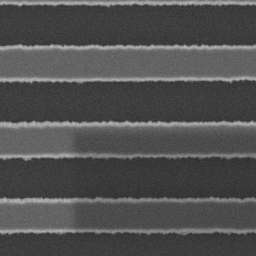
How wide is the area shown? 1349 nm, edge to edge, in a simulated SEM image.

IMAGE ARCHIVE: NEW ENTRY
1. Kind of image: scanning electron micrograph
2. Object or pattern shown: lines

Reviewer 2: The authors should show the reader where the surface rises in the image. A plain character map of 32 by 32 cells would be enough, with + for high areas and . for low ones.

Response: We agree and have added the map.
..+++++.++.+++......+.++......++
................................
................................
................................
................................
................................
++++++++++++++++++++++++++++++++
++++++++++++++++++++++++++++++++
++++++++++++++++++++++++++++++++
++++++++++++++++++++++++++++++++
................................
................................
................................
................................
................................
++++++++++++++++++++++++++++++++
++++++++++++++++++++++++++++++++
++++++++++++++++++++++++++++++++
++++++++++++++++++++++++++++++++
++++++++++++++++++++++++++++++++
................................
................................
................................
................................
................................
++++++++++++++++++++++++++++++++
++++++++++++++++++++++++++++++++
++++++++++++++++++++++++++++++++
++++++++++++++++++++++++++++++++
................................
................................
................................